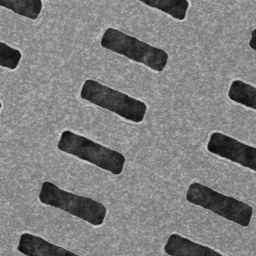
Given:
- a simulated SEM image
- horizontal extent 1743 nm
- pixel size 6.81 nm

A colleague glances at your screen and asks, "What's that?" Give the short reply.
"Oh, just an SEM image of holes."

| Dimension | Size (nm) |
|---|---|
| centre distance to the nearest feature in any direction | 379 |